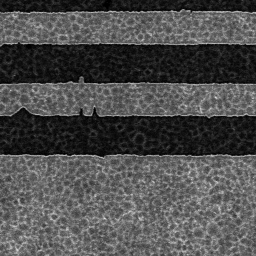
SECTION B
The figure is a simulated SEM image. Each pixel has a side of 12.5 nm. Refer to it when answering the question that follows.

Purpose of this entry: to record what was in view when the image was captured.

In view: one or a few lines or trenches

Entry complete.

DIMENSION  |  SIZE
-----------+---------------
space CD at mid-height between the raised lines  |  499 nm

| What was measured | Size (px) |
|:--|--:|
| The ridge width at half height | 31.2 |